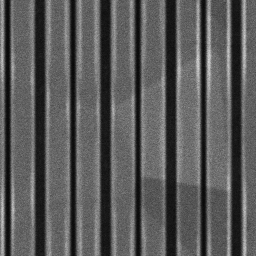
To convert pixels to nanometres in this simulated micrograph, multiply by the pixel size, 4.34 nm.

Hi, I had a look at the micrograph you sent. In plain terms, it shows parallel lines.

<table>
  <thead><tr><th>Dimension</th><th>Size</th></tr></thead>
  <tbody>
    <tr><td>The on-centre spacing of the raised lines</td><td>142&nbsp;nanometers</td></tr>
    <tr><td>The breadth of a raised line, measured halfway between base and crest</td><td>105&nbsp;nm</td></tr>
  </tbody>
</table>